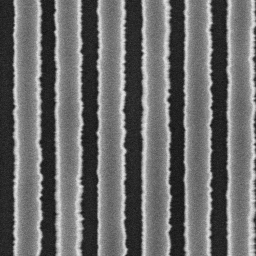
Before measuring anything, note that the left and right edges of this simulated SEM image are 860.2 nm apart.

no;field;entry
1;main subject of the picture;lines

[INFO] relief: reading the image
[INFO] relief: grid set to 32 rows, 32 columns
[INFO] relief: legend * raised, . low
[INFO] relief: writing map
..***..***..***...***..***...***
..***..***..****..***..***..****
..***..***..***...***..***..****
..***..***..***...***..***..****
..***..***..***...***..***..****
..***..***..***...***..***..****
..***..***..****..***..***...***
..***..***..***...***..***..***.
..***..***..***...***..***..****
..***..***..***...***..***..****
..***..***..***...***..***...***
..***..***..***...***..***..****
..***..***..***...***..***..****
..***..***..***...***..***..****
..***..***..***...***..***..****
..***..***..***...***..***..****
..***..***..****..***..***..****
..***..***..***...***..***..****
..***..***..***...***..***..****
..***..***..****..***..***..****
..***..***..****..***..***..****
..***..***..****..***..***..****
..***..***..***...***..***...***
..***..***..***...***..***..****
..***..***..****..***..***..****
..***..***..***...***..***..****
..***..***..***...***..***..****
..***..***..***...***..***..***.
..***..***..***...***..***..****
..***..***..****..***..***..****
..***..***..****..***..***...***
..***..***..****..***..***...***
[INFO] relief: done